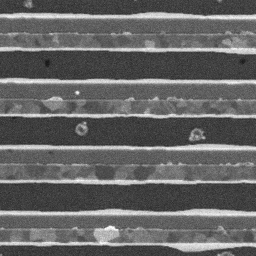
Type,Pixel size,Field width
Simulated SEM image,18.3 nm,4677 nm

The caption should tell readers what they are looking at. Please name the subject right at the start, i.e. lines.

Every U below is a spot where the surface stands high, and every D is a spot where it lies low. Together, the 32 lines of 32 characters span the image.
DDDDDDDDDDDDDDDDDDDDDDDDDDDDDDDD
DDDDDDDDDDDDDDDDDDDDDDDDDDDDDDDD
UUUUUUUUUUUUUUUUUUUUUUUUUUUUUUUU
UUUUUUUUUUUUUUUUUUUUUUUUUUUUUUUU
UUUUUUUUUUUUUUUUUUUUUUUUUUUUUUUU
UUUUUUUUUUUUUUUUUUUUUUUUUUUUUUUU
DDDDDDDDDDDDDDDDDDDDDDDDDDDDDDDD
DDDDDDDDDDDDDDDDDDDDDDDDDDDDDDDD
DDDDDDDDDDDDDDDDDDDDDDDDDDDDDDDD
DDDDDDDDDDDDDDDDDDDDDDDDDDDDDDDD
UUUUUUUUUUUUUUUUUUUUUUUUUUUUUUUU
UUUUUUUUUUUUUUUUUUUUUUUUUUUUUUUU
UUUUUUUUUUUUUUUUUUUUUUUUUUUUUUUU
UUUUUUUUUUUUUUUUUUUUUUUUUUUUUUUU
DDDDDDDDDDDDDDDDDDDDDDDDDDDDDDDD
DDDDDDDDDDDDDDDDDDDDDDDDDDDDDDDD
DDDDDDDDDDDDDDDDDDDDDDDDDDDDDDDD
DDDDDDDDDDDDDDDDDDDDDDDDDDDDDDDD
UUUUUUUUDDDDDDDDDDDDDDDDDUUDDDDD
UUUUUUUUUUUUUUUUUUUUUUUUUUUUUUUU
UUUUUUUUUUUUUUUUUUUUUUUUUUUUUUUU
UUUUUUUUUUUUUUUUUUUUUUUUUUUUUUUU
UUDUUUUUUUUUUUUUUUUUUUUUUUUUUUUU
DDDDDDDDDDDDDDDDDDDDDDDDDDDDDDDD
DDDDDDDDDDDDDDDDDDDDDDDDDDDDDDDD
DDDDDDDDDDDDDDDDDDDDDDDDDDDDDDDD
DDDDDDDDDDDDDDDDDDDDDDDDDDDDDDDD
UUUUUUUUUUUUUUUUUUUUUUUUUUUUUUUU
UUUUUUUUUUUUUUUUUUUUUUUUUUUUUUUU
UUUUUUUUUUUUUUUUUUUUUUUUUUUUUUUU
DDDDDDDDDDDDDDDDDDDDDDUUUUUUUDDD
DDDDDDDDDDDDDDDDDDDDDDDDDDDDDDDD